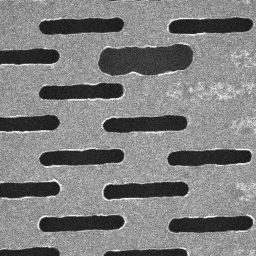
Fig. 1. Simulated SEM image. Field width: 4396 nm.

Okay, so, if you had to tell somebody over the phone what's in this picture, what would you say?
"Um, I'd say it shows a regular array of holes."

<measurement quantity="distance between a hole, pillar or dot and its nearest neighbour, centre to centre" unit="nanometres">1130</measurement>